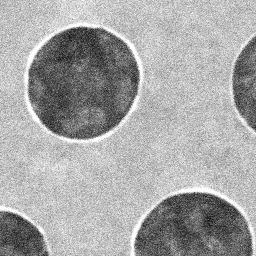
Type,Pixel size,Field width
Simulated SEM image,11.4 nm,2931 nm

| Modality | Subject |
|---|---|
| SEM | holes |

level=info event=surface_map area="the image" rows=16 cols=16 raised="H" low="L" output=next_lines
HHHHHHHHHHHHHHHH
HHHHHHHHHHHHHHHH
HHHLLLLLHHHHHHHH
HHLLLLLLHHHHHHHL
HHLLLLLLLHHHHHHL
HHLLLLLLLHHHHHHL
HHLLLLLLHHHHHHHL
HHLLLLLLHHHHHHHL
HHHHLLHHHHHHHHHH
HHHHHHHHHHHHHHHH
HHHHHHHHHHHHHHHH
HHHHHHHHHHHHHHHH
HHHHHHHHHHLLLLHH
LHHHHHHHHLLLLLLH
LLLHHHHHHLLLLLLL
LLLHHHHHLLLLLLLL